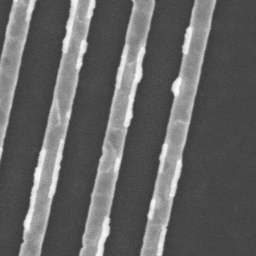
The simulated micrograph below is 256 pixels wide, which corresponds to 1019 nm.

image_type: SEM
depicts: parallel lines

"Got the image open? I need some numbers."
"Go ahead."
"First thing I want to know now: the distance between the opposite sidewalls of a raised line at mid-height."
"79.9 nanometres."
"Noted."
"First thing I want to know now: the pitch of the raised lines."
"236 nm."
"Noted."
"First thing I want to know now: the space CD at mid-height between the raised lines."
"155 nm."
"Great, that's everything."